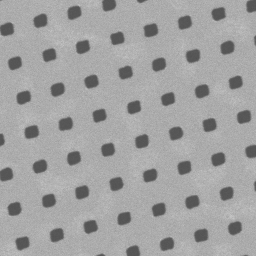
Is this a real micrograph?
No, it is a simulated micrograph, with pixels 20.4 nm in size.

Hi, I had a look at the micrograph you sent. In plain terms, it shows a regular array of holes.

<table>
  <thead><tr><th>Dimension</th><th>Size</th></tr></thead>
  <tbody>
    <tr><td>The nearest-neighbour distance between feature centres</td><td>709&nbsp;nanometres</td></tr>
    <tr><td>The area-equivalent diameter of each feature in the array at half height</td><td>284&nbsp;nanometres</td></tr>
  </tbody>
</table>